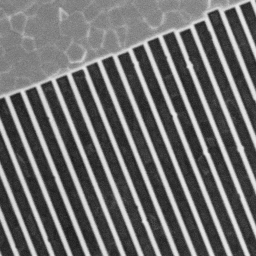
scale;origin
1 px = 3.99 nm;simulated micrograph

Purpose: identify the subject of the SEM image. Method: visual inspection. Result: parallel lines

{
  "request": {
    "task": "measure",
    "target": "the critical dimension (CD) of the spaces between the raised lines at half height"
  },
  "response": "52.4 nm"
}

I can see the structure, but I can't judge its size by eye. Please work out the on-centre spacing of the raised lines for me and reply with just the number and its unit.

65.5 nanometres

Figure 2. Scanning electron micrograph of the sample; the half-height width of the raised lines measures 2.78 pixels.